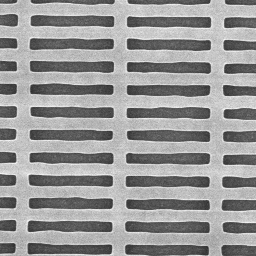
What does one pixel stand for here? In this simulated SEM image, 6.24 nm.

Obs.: groups of lines, slits or small figures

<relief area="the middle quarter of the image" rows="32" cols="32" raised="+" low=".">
.............+++................
.............+++................
++++++++++++++++++++++++++++++++
++++++++++++++++++++++++++++++++
++++++++++++++++++++++++++++++++
............++++................
.............+++................
............++++................
++++++++++++++++++++++++++++++++
++++++++++++++++++++++++++++++++
++++++++++++++++++++++++++++++++
.............+++................
.............+++................
............++++................
++++++++++++++++++++++++++++++++
++++++++++++++++++++++++++++++++
........+++++++++++++......+++++
............++++................
............++++................
++++++++++++++++++++++.........+
++++++++++++++++++++++++++++++++
++++++++++++++++++++++++++++++++
............++++................
.............++.................
............++++................
++++++++++++++++++++++++++++++++
++++++++++++++++++++++++++++++++
++++++++++++++++++++++++++++++++
............+++.................
............+++.................
............++++................
++++++++++++++++++++++++++++++++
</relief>